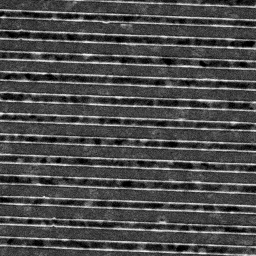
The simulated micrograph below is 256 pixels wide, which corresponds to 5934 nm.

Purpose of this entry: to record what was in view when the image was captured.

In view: parallel lines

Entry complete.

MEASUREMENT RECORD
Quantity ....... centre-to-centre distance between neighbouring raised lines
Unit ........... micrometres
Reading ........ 0.479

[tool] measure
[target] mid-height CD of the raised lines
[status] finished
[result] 203 nanometers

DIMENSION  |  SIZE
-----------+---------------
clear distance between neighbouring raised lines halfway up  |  11.9 pixels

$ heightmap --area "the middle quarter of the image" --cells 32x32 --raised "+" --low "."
............................++++
................................
................................
++++++++++++++++++++++++........
++++++++++++++++++++++++++++++++
.....................+++++++++++
................................
................................
++++++++++++++++++++............
++++++++++++++++++++++++++++++++
...............+++++++++++++++++
................................
................................
++++++++++++++..................
++++++++++++++++++++++++++++++++
..................++++++++++++++
................................
................................
++++++++........................
++++++++++++++++++++++++++++++++
...............+++++++++++++++++
................................
................................
++++++++........................
++++++++++++++++++++++++++++++++
......++++++++++++++++++++++++++
...............................+
................................
+++++...........................
++++++++++++++++++++++++++++++..
...+++++++++++++++++++++++++++++
.........................+++++++